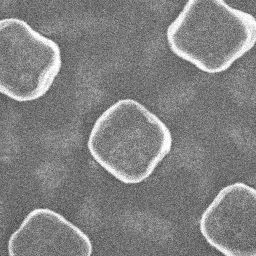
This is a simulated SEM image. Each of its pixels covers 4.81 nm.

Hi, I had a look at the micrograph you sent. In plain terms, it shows raised bodies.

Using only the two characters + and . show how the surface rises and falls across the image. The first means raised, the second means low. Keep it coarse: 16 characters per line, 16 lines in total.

............++..
++.........+++++
+++........+++++
++++........+++.
+++.............
+++.............
.......++.......
......++++......
......++++......
......++++......
.......+++......
................
.............+++
..++.........+++
.++++........+++
.+++++........++